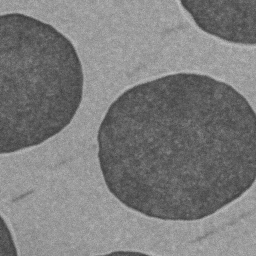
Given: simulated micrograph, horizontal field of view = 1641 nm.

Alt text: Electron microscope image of holes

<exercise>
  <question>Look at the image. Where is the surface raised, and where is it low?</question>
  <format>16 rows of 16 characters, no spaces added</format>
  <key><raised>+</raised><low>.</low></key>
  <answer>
++++++++++++....
...+++++++++....
....++++++++++..
.....+++++++++++
.....+++++++++++
.....+++.......+
.....++.........
....++..........
...+++..........
.+++++..........
++++++..........
+++++++.........
+++++++........+
+++++++++....+++
.+++++++++++++++
.+++++++++++++++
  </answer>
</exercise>